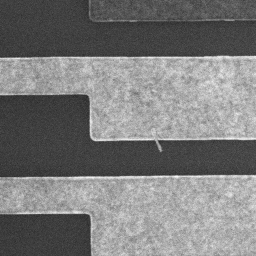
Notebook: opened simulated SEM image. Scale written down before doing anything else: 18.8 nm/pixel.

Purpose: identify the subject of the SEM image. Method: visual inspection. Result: wiring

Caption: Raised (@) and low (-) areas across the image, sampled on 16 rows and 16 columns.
------@@@@@@@@@@
----------------
----------------
----------------
@@@@@@@@@@@@@@@@
@@@@@@@@@@@@@@@@
------@@@@@@@@@@
------@@@@@@@@@@
------@@@@@@@@@@
----------------
----------------
@@@@@@@@@@@@@@@@
@@@@@@@@@@@@@@@@
-----@@@@@@@@@@@
------@@@@@@@@@@
------@@@@@@@@@@